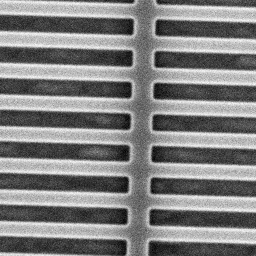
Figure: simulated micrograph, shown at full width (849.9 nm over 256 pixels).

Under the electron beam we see groups of lines, slits or small figures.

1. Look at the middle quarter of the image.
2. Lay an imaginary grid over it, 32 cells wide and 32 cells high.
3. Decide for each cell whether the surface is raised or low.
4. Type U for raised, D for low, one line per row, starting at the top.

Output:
UDDDDDDDDDDDDDDDDUUUUUDDDDDDDDDD
UUUUUUUUUUUUUUUUUUUUUUUUUUUUUUUU
UUUUUUUUUUUUUUUUUUUUUUUUUUUUUUUU
UUUUUUUUUUUUUUUUUUUUUUUUUUUUUUUU
DDDDDDDDDDDDDDDDDUUUUUUDDDUUUUUU
DDDDDDDDDDDDDDDDDUUUUUDDDDDDDDDD
DDDDDDDDDDDDDDDDDUUUUUDDDDDDDDDD
DDDDDDDDDDDDDDDDDUUUUUDDDDDDDDDD
UUUUUUUDDDDDDDDDDUUUUUDDDDDDDDDD
UUUUUUUUUUUUUUUUUUUUUUUUUUUUUUUU
UUUUUUUUUUUUUUUUUUUUUUUUUUUUUUUU
UUUUUUUUUUUUUUUUUUUUUUUUUUUUUUUU
DDDDDDDDDDDDDDDDDUUUUUUDDDUUUUUU
DDDDDDDDDDDDDDDDDUUUUUDDDDDDDDDD
DDDDDDDDDDDDDDDDDUUUUUDDDDDDDDDD
DDDDDDDDDDDDDDDDDUUUUUDDDDDDDDDD
UUUUUUDDDDDDDDDDDUUUUUDDDDDDDDDD
UUUUUUUUUUUUUUUUUUUUUUUUUUUUUUUU
UUUUUUUUUUUUUUUUUUUUUUUUUUUUUUUU
UUUUUUUUUUUUUUUUUUUUUUUUUUUUUUUU
DDDDDDDDDDDDDDDDDUUUUUDDDDDDDDDD
DDDDDDDDDDDDDDDDDUUUUUDDDDDDDDDD
DDDDDDDDDDDDDDDDDUUUUDDDDDDDDDDD
DDDDDDDDDDDDDDDDDUUUUDDDDDDDDDDD
UUUUUUUUUUUUUDDDUUUUUUDDDDDDDDDD
UUUUUUUUUUUUUUUUUUUUUUUUUUUUUUUU
UUUUUUUUUUUUUUUUUUUUUUUUUUUUUUUU
DDDUUUUUUUUUUUUUUUUUUUUUUUUUUUUU
DDDDDDDDDDDDDDDDUUUUUUDDDDDDDDDD
DDDDDDDDDDDDDDDDDUUUUDDDDDDDDDDD
DDDDDDDDDDDDDDDDDUUUUDDDDDDDDDDD
DDDDDDDDDDDDDDDDUUUUUDDDDDDDDDDD